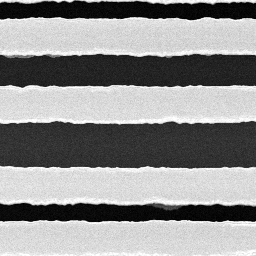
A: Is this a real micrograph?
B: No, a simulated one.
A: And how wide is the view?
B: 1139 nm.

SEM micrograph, lines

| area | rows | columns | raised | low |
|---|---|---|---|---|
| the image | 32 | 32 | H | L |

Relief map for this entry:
LLLLLLLLLLLLLLLLLLLLHLLLLLHLLLLL
LLLLLLLLLLLLLLLLLLLLLLLLLLLLLLLL
HHHHHHHHHHHHHHHHHHHHHHHHHHHHHHHH
HHHHHHHHHHHHHHHHHHHHHHHHHHHHHHHH
HHHHHHHHHHHHHHHHHHHHHHHHHHHHHHHH
HHHHHHHHHHHHHHHHHHHHHHHHHHHHHHHH
HHHHHHHHHHHHHHHHHHHHHHHHHHHHHHHH
LLLLLLLLLLLLLLLLLLLLLLLLLLLLLLLL
LLLLLLLLLLLLLLLLLLLLLLLLLLLLLLLL
LLLLLLLLLLLLLLLLLLLLLLLLLLLLLLLL
LLLLLLLLLLLLLLLLLLLLLLLLLLLLLLLL
HHHHHHHHHHHHHHHHHHHHHHHHHHHHHHHH
HHHHHHHHHHHHHHHHHHHHHHHHHHHHHHHH
HHHHHHHHHHHHHHHHHHHHHHHHHHHHHHHH
HHHHHHHHHHHHHHHHHHHHHHHHHHHHHHHH
LLLLLLLLLLLLLLLLLLLLLLLLLLLLLLLL
LLLLLLLLLLLLLLLLLLLLLLLLLLLLLLLL
LLLLLLLLLLLLLLLLLLLLLLLLLLLLLLLL
LLLLLLLLLLLLLLLLLLLLLLLLLLLLLLLL
LLLLLLLLLLLLLLLLLLLLLLLLLLLLLLLL
LLLLLLLLLLLLLLLLLLLLLLLLLLLLLLLL
HHHHHHHHHHHHHHHHHHHHHHHHHHHHHHHH
HHHHHHHHHHHHHHHHHHHHHHHHHHHHHHHH
HHHHHHHHHHHHHHHHHHHHHHHHHHHHHHHH
HHHHHHHHHHHHHHHHHHHHHHHHHHHHHHHH
HHLLHHHHHHLHHHHHHHHLHHHHHHHHHHHH
LLLLLLLLLLLLLLLLLLLLLLLLLLLLLLLL
LLLLLLLLLLLLLLLLLLLLLLLLLLLLLLLL
HHHHHHHHHHHHHHHHHHHHHHHHHHHHHHHH
HHHHHHHHHHHHHHHHHHHHHHHHHHHHHHHH
HHHHHHHHHHHHHHHHHHHHHHHHHHHHHHHH
HHHHHHHHHHHHHHHHHHHHHHHHHHHHHHHH